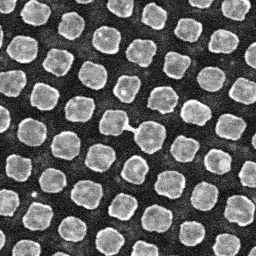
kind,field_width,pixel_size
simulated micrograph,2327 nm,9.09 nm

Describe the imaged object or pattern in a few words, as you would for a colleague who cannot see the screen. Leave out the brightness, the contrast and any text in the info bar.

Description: a regular array of raised bodies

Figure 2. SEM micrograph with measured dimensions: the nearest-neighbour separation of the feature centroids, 0.334 micrometres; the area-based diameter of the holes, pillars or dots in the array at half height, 240 nm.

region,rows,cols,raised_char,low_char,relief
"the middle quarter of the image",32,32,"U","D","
UUDDDUUUUDDDDDDDDDDDUDDDDUUUUUUD
UDDDUUUUUUDDDDDDDDDDDDDDDUUUUUDD
DDDDUUUUUUUDDDDDDDDDDDDDDDUUUUDD
DDDDUUUUUUUDDDUUUUDDDDDDDDDDUDDD
DDDDUUUUUUDDDUUUUUUDDDDDDDDDDDDD
DDDDDDUUUUDDDUUUUUUDDDDDDDDDDDDD
DDDDDDDDDDDDDUUUUUDDDDDUUUUDDDDD
DDDDDDDDDDDDDUUUUUDDDDUUUUUUDDDD
DDUUUDDDDDDDDDUUUDDDDUUUUUUUDDDD
DUUUUUUDDDDDDDDUUDDDDUUUUUUUDDDD
DUUUUUUUDDDDDDDDDDDDDUUUUUUUDDUU
UUUUUUUDDDDDDDDDDDDDDDDDUUUDDDUU
UUUUUUUDDDUUUUUUDDDDDDDDDDDDDUUU
DUUUUUDDDDUUUUUUDDDDDDDDDDDDDDUU
DDDDDDDDDUUUUUUUDDDDDUDDDDDDDDUU
DDDDDDDDDUUUUUUUDDDUUUUUDDDDDDDD
DDDDDDDDDUUUUUUDUUUUUUUUUDDDDDDD
UUDDDDDDDDUUUUDDDDUUUUUUUDDDDDDD
UUUUDDDDDDDDDDDDDDUUUUUUUDDDUUDD
UUUUDDDDDDDDDDDDDDUUUUUUUDDUUUUU
UUUUDDDUUUDDDDDDDDDUUUUUDDDUUUUU
UUUUDDUUUUUUDDDDDDDDUUUDDDDUUUUU
UUUDDDUUUUUUUDDDDDDDDDDDDDDUUUUU
UUDDDDUUUUUUUDDDDUUDDDDDDDDDUUUU
DDDDDUUUUUUUDDDDUUUUDDDDDDDDDDDD
DDDDDDUUUUUDDDDUUUUUUDDDDDDDDDDD
DDDDDDDDUUUDDDDUUUUUUDDDDDDDDDDD
DDDDDDDDDDDDDDDUUUUUDDDDUUUUUDDD
DDDDDDDDDDDDDDDUUUUUDDDDUUUUUUDD
DDDDUUUDDDDDDDDDUUUUDDDUUUUUUUDD
DDDUUUUUUDDDDDDDDDDDDDDUUUUUUUDD
DDUUUUUUUDDDDDDDDDDDDDDUUUUUUUDD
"